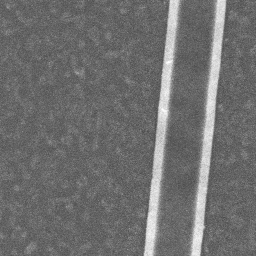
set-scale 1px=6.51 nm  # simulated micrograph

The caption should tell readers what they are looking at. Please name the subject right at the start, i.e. one or a few lines or trenches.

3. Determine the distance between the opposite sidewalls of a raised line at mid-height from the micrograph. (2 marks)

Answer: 307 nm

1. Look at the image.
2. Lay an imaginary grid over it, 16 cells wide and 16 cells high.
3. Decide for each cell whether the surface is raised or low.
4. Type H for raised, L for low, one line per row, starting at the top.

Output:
LLLLLLLLLLLHHHLL
LLLLLLLLLLLHHHLL
LLLLLLLLLLLHHHLL
LLLLLLLLLLLHHHLL
LLLLLLLLLLHHHLLL
LLLLLLLLLLHHHLLL
LLLLLLLLLLHHHLLL
LLLLLLLLLLHHHLLL
LLLLLLLLLLHHHLLL
LLLLLLLLLLHHHLLL
LLLLLLLLLLHHHLLL
LLLLLLLLLLHHHLLL
LLLLLLLLLLHHHLLL
LLLLLLLLLLHHLLLL
LLLLLLLLLHHHLLLL
LLLLLLLLLHHHLLLL